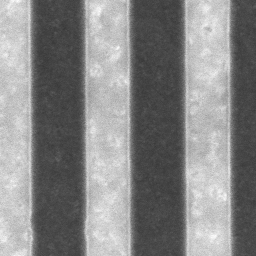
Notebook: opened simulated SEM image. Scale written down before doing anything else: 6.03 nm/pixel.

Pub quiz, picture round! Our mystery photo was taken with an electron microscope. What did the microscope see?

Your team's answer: one or a few lines or trenches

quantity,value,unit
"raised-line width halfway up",349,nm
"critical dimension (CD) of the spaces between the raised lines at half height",255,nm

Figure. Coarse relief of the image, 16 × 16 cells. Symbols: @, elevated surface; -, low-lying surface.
--@@@@--@@@@--@@
--@@@@--@@@@--@@
--@@@---@@@@--@@
--@@@---@@@@--@@
--@@@---@@@@--@@
--@@@---@@@@--@@
--@@@---@@@@--@@
--@@@---@@@@--@@
--@@@---@@@@--@@
--@@@---@@@@--@@
--@@@---@@@@--@@
--@@@---@@@@--@@
--@@@---@@@@--@@
--@@@---@@@@--@@
--@@@---@@@@--@@
--@@@---@@@@--@@